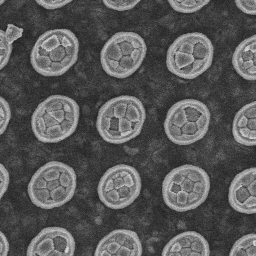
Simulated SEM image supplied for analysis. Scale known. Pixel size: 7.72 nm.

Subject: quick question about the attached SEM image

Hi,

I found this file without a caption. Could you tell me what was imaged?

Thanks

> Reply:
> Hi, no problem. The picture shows a regular array of raised bodies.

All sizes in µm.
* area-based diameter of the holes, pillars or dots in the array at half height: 0.337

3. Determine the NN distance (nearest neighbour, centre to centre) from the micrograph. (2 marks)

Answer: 511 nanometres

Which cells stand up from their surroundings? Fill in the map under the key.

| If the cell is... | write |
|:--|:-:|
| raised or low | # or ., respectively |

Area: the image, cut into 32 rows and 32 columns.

.....###.....####.....####....##
...............................#
................................
.#..............................
##...####......##......##.......
#...######...#####....####....##
#...#####....#####...#####....##
#...#####....#####...#####...###
.....###.....####....#####....##
...............................#
................................
................................
......###.....###...............
#....#####...#####....####....##
#...######..######...#####....##
#...######..######...#####...###
....#####....####....####....###
.....##......###......##......##
................................
................................
......#.........................
#....####.....###.....###......#
#...#####....####....#####....##
#...#####....####....#####...###
....#####....####....#####...###
.....##......###.....####....###
................................
................................
................................
.....####....####.....###......#
#...#####...#####....#####....##
#...#####...######...#####...###